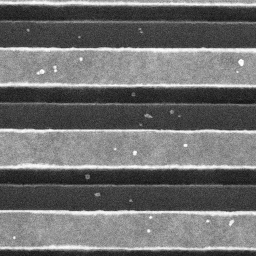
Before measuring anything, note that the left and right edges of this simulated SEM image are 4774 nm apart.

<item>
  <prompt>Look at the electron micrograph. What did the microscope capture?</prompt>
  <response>lines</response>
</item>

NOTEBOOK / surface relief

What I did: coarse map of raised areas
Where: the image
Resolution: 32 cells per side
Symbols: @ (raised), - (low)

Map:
-----@@@@-@@@@@@@@@@@@@@@@@@@@@@
--------------------------------
--------------------------------
--------------------------------
--------------------------------
--------------------------------
@@@@@@@@@@@@@@@@@@@@@@@@@@@@@@@@
@@@@@@@@@@@@@@@@@@@@@@@@@@@@@@@@
@@@@@@@@@@@@@@@@@@@@@@@@@@@@@@@@
@@@@@@@@@@@@@@@@@@@@@@@@@@@@@@@@
@@@@@@@@@@@@@@@@@@@@@@@@@@@@@@@@
--------------------------------
--------------------------------
--------------------------------
--------------------------------
--------------------------------
@@@@@@@@@@@@@@@@@@@@@@@@@@@@@@@@
@@@@@@@@@@@@@@@@@@@@@@@@@@@@@@@@
@@@@@@@@@@@@@@@@@@@@@@@@@@@@@@@@
@@@@@@@@@@@@@@@@@@@@@@@@@@@@@@@@
@@@@@@@@@@@@@@@@@@@@@@@@@@@@@@@@
--------------------------------
--------------------------------
--------------------------------
--------------------------------
--------------------------------
@@@@@@@@@@@@@@@@@@@@@@@@@@@@@@@@
@@@@@@@@@@@@@@@@@@@@@@@@@@@@@@@@
@@@@@@@@@@@@@@@@@@@@@@@@@@@@@@@@
@@@@@@@@@@@@@@@@@@@@@@@@@@@@@@@@
@@@@@@@@@@@@@@@@@@@@@@@@@@@@@@@@
--------------------------------